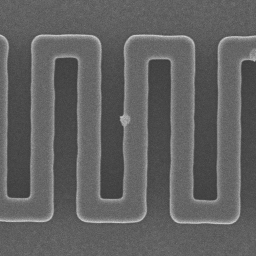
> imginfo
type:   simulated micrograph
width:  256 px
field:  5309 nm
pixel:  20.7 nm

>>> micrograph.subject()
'groups of lines, slits or small figures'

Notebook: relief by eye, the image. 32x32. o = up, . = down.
................................
................................
................................
................................
.....oooooo......ooo............
o...ooooooooo...oooooooo...ooooo
o...ooooooooo...oooooooo...ooooo
o...ooo...ooo...ooo..ooo...ooooo
o...ooo...ooo...oo...ooo...ooo..
o...ooo...ooo...oo...ooo...ooo..
o...ooo...ooo...oo...ooo...ooo..
o...ooo...ooo...oo...ooo...ooo..
o...ooo...ooo...oo...ooo...ooo..
o...ooo...ooo...oo...ooo...ooo..
o...ooo...ooo..ooo...ooo...ooo..
o...ooo...ooo..ooo...ooo...ooo..
o...ooo...ooo...oo...ooo...ooo..
o...ooo...ooo..ooo...ooo...ooo..
o...ooo...ooo..ooo...ooo...ooo..
o...ooo...ooo..ooo...ooo...ooo..
o...ooo...ooo...oo...ooo...ooo..
o...ooo...oo....oo...ooo...ooo..
o...ooo...oo...ooo...ooo...ooo..
o...ooo...oo...ooo...ooo...ooo..
o...ooo...ooo..ooo...ooo...ooo..
ooooooo...oooooooo...ooooooooo..
ooooooo...oooooooo...ooooooooo..
oooooo....oooooooo....oooooooo..
................................
................................
................................
................................